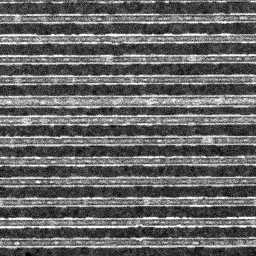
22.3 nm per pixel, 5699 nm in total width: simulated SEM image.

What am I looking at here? parallel lines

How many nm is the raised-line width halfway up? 303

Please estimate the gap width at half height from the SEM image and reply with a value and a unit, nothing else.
161 nm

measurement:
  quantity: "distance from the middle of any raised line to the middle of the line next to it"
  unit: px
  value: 20.4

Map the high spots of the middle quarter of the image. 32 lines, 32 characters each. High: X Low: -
XXXXXXXXXXXXXXXXXXXXXXXXXXXXXXXX
XXXXXXXXXXXXXXXXXXXXXXXXXXXXXXXX
XXXXXXXXXXXXXXXXXXXXXXXXXXXXXXXX
--------------------------------
--------------------------------
XXXXXXXXXXXXXXXXXXXXXXXXXXXXXXXX
XXXXXXXXXXXXXXXXXXXXXXXXXXXXXXXX
XXXXXXXXXXXXXXXXXXXXXXXXXXXXXXXX
--------------------------------
--------------------------------
--------------------------------
XXXXXXXXXXXXXXXXXXXXXXXXXXXXXXXX
XXXXXXXXXXXXXXXXXXXXXXXXXXXXXXXX
--------------------------------
--------------------------------
XXXXXXXXXXXXXXXXXXXXXXXXXXXXXXXX
XXXXXXXXXXXXXXXXXXXXXXXXXXXXXXXX
XXXXXXXXXXXXXXXXXXXXXXXXXXXXXXXX
--------------------------------
--------------------------------
XXXXXXXXXXXXXXXXXXXXXXXXXXXXXXXX
XXXXXXXXXXXXXXXXXXXXXXXXXXXXXXXX
XXXXXXXXXXXXXXXXXXXXXXXXXXXXXXXX
--------------------------------
--------------------------------
XXXXXXXXXXXXXXXXXXXXXXXXXXXXXXXX
XXXXXXXXXXXXXXXXXXXXXXXXXXXXXXXX
XXXXXXXXXXXXXXXXXXXXXXXXXXXXXXXX
------------XXXXXXXXX-----------
--------------------------------
XXXXXXXXXXXXXXXXXXXXXXXXXXXXXXXX
XXXXXXXXXXXXXXXXXXXXXXXXXXXXXXXX